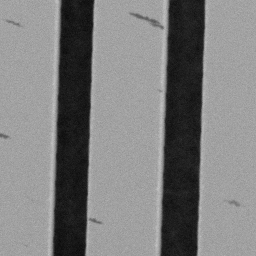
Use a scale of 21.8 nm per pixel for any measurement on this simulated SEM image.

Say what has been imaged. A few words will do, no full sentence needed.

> lines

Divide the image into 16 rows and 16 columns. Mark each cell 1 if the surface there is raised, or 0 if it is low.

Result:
1111001111000111
1111001111000111
1111001111000111
1111001111000111
1111001111000111
1111001111000111
1111001111000111
1111001111000111
1111001111000111
1110001111000111
1110001111000111
1110001111000111
1110011111001111
1110011111001111
1110011111001111
1110011111001111